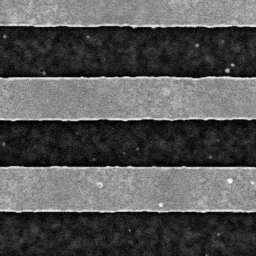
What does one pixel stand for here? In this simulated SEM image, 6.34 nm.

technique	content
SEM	lines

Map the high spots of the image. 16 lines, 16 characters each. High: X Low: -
XXXXXXXXXXXXXXXX
XXXXXXXXXXXXXXXX
----------------
----------------
----------------
XXXXXXXXXXXXXXXX
XXXXXXXXXXXXXXXX
X--XX--X--------
----------------
----------------
XXXXXXXXXXXXXXXX
XXXXXXXXXXXXXXXX
XXXXXXXXXXXXXXXX
----------------
----------------
----------------